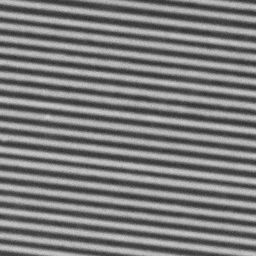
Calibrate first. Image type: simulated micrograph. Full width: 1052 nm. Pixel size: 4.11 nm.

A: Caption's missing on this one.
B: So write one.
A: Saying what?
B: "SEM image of parallel lines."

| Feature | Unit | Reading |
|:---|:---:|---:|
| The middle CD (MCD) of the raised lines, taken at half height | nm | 18.8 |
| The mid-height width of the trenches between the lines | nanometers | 33.6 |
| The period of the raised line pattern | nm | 50.3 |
